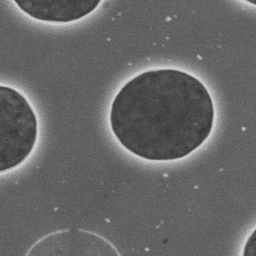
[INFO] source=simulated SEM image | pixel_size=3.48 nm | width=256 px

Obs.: holes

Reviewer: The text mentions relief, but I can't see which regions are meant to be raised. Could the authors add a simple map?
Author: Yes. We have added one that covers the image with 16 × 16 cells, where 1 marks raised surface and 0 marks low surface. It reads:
1000001111111111
1111111111111111
1111111111111111
1111111111111111
1111111110011111
0111111100000111
0011111000000111
0011111000000111
0011111000000111
0011111100001111
0111111111111111
1111111111111111
1111111111111111
1111111111111111
1111111111111111
1111111111111110